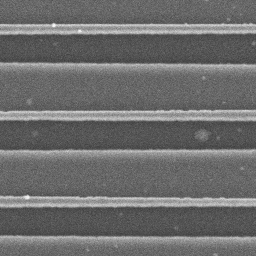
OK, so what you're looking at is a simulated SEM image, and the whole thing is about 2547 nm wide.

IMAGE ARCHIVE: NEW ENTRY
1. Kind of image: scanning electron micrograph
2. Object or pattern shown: lines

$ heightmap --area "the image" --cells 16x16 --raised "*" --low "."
****************
****************
................
................
****************
****************
****************
................
................
****************
****************
****************
****************
................
................
****************